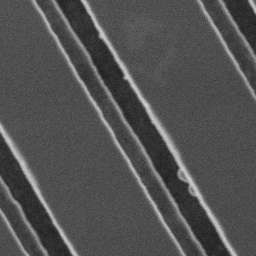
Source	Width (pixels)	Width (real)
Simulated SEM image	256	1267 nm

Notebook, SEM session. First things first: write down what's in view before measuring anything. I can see lines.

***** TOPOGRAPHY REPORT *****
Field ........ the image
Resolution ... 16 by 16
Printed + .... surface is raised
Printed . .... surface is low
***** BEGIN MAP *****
++...++++++++...
+++...+++++++...
++++..++++++++..
++++...++++++++.
+++++...+++++++.
+++++...++++++++
++++++...+++++++
+++++++...++++++
+++++++...++++++
.+++++++...+++++
.+++++++...+++++
..+++++++...++++
...+++++++..++++
...+++++++...+++
+...+++++++...++
+...+++++++...++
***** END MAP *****